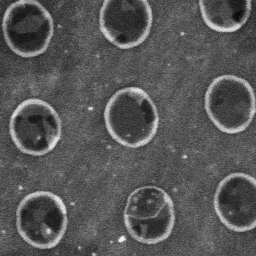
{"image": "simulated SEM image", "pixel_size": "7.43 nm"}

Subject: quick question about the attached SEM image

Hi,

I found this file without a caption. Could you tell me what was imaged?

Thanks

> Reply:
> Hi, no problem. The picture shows raised bodies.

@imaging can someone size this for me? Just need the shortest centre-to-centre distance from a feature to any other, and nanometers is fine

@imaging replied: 729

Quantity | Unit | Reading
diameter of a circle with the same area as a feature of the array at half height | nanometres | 374